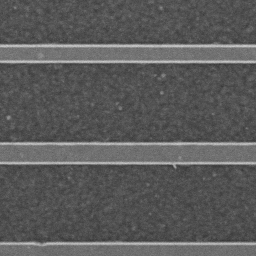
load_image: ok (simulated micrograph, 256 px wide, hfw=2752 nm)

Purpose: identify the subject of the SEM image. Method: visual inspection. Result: one or a few lines or trenches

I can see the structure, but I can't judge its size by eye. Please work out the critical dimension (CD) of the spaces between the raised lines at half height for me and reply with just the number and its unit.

0.876 µm